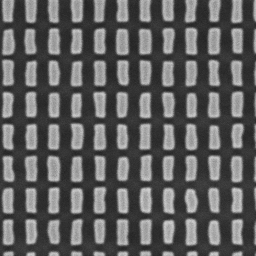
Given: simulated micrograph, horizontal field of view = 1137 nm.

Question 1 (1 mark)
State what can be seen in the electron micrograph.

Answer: groups of lines, slits or small figures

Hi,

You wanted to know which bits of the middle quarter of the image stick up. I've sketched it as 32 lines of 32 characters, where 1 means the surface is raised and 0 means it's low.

00110000110000110001110001100001
00110000110000110001110001100001
00110000110001110001110001100001
00110000110000110001110001100001
00110000110000110001100001100001
00000000000000000000000000000000
00000000000000000000000000000000
00010000110001110000100001100001
00110000110001110001100001100001
00110000110001110001100001100001
00110000110001110001100001100001
00110000110001110001100001100001
00110000110001110001110001100001
00000000000000000000000000000000
00000000000000000000000000000000
00110000110001100001110001100001
00111000110001110001100001100001
00111000110000110001100001100001
00111000110001110001100001100001
00111000110001110001100001100001
00110000110000110001100001100001
00000000000000000000000000000000
00000000000000000000000000000000
00010000110000110001110001100001
00110000110000110001110001100001
00110000110000110001110001100001
00110000110000110001110001100001
00110000110001110001110001100001
00110000110000110001110001100001
00000000000000000000000000000000
00000000000000000000000000000000
00110000110000110001110001100001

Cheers